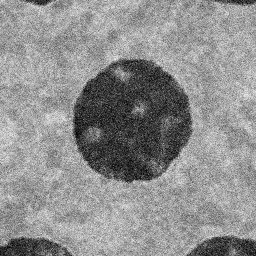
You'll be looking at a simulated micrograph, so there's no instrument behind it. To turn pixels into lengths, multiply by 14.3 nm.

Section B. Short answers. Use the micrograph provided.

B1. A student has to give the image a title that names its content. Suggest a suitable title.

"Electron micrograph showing holes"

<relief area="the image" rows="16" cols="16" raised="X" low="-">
XXXXXXXXXXXXXXXX
XXXXXXXXXXXXXXXX
XXXXXXXXXXXXXXXX
XXXXXXXXXXXXXXXX
XXXXXX----XXXXXX
XXXXX------XXXXX
XXXXX-------XXXX
XXXXX-------XXXX
XXXXX-------XXXX
XXXXX------XXXXX
XXXXXX-----XXXXX
XXXXXXXXXXXXXXXX
XXXXXXXXXXXXXXXX
XXXXXXXXXXXXXXXX
XXXXXXXXXXXXXXXX
----XXXXXXXX----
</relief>